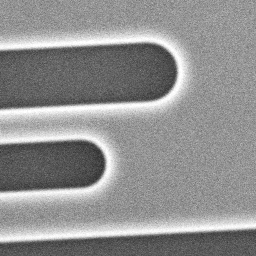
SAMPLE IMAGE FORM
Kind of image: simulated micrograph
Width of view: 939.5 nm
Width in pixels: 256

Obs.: groups of lines, slits or small figures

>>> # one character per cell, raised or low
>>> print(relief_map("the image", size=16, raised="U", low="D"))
UUUUUUUUUUUUUUUU
UUUUUUUUUUUUUUUU
UUUUUUUUUUUUUUUU
DDDDDDDDDDDUUUUU
DDDDDDDDDDDUUUUU
DDDDDDDDDDDUUUUU
DDDDDDDDDUUUUUUU
UUUUUUUUUUUUUUUU
UUUUUUUUUUUUUUUU
DDDDDDUUUUUUUUUU
DDDDDDDUUUUUUUUU
DDDDDDUUUUUUUUUU
UUUUUUUUUUUUUUUU
UUUUUUUUUUUUUUUU
UUUUUUUUUUDDDDDD
DDDDDDDDDDDDDDDD